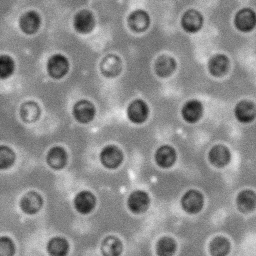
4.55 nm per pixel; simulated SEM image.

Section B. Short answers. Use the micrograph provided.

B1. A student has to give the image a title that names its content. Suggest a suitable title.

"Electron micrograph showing a regular array of holes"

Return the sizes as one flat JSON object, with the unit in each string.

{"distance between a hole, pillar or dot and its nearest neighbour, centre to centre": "238 nanometers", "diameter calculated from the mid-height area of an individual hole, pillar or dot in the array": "110 nm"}